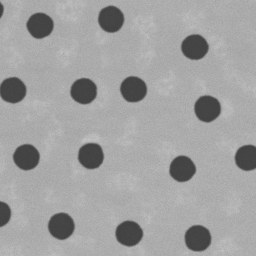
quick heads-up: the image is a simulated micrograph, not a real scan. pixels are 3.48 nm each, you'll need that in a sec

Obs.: a regular array of holes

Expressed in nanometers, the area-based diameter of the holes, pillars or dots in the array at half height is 90.4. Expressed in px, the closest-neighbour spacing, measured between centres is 64.8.